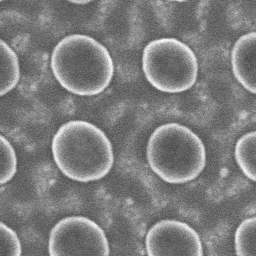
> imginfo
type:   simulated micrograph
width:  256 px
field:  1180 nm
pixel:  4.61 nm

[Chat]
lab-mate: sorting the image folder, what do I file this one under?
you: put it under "raised bodies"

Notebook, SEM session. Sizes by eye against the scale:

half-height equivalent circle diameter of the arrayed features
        264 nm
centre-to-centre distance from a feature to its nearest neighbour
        402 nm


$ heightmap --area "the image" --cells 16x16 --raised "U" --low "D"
DDDDDDDDDDDDDDDD
DDDDDDDDDDDDDDDD
DDDDUUDDDDDDDDDU
UDDUUUUDDUUUDDDU
UDDUUUUDDUUUDDDU
UDDDUUDDDDUUDDDU
DDDDDDDDDDDDDDDD
DDDDDDDDDDDDDDDD
DDDDUUDDDDUUDDDU
UDDUUUUDDUUUUDDU
UDDDUUUDDDUUUDDU
DDDDDDDDDDDDDDDD
DDDDDDDDDDDDDDDD
DDDDDDDDDDDDDDDD
UDDUUUDDDUUUDDDU
UDDUUUUDDUUUUDDU